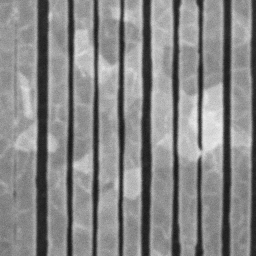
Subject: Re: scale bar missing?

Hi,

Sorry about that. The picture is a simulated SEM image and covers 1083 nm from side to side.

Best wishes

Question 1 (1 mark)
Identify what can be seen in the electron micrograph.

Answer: parallel lines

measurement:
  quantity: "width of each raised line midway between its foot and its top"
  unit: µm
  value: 0.0789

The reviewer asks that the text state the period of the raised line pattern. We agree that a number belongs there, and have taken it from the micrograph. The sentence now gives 114 nm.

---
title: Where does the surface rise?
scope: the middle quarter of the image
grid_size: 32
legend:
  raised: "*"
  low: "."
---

*..****..****..****...*****..***
*..****..****..****...*****..***
*..****..****..****...*****..***
*..****..****..****...*****..***
*..****..****..****...*****..***
*..****..****..****...*****..***
*..****..****..****...*****..***
*..****..****..****...*****..***
*..****..****..****...*****..***
*..****..****..****...*****..***
*..****..****..****...*****..***
*..****..****..****...*****..***
*..****..****..****...*****..***
*..****..****..****...*****..***
*..****..****..****...*****..***
*..****..****...***...*****..***
*..****..****...***...*****..***
*..****..****...***...*****..***
*..****..****...***...*****..***
...****..****...***...*****..***
...****..****...***...*****..***
...****..****..****...*****..***
...****..****..****...*****..***
...****..****..****...*****..***
...****..****..****...*****..***
...****..****..****...*****..***
...****..****..****...*****..***
...****..****..****...*****..***
...****..****..****...*****..***
...****..****..****...*****..***
...****..****..****...*****..***
...****..****..****...*****..***